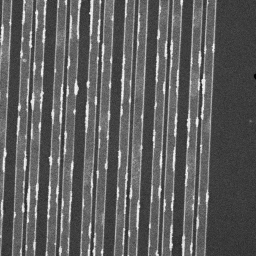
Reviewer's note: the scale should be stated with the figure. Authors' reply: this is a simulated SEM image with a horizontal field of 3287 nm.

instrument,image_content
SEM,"parallel lines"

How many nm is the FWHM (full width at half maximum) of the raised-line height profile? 114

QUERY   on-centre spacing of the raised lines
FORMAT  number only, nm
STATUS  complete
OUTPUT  215